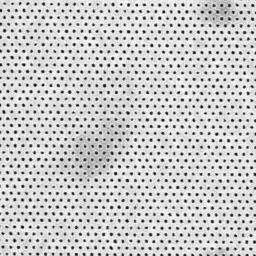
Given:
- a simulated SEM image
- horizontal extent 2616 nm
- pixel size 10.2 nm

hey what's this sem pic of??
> a regular array of holes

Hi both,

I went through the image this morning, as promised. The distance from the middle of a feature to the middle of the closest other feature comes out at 75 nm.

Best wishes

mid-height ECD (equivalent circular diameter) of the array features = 36.5 nm